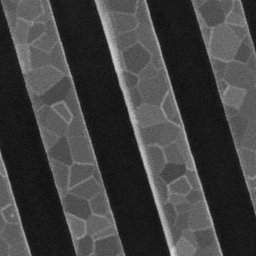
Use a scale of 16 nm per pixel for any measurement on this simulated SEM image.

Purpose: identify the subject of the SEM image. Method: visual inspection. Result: lines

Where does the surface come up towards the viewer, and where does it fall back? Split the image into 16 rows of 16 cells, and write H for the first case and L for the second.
HHHLLLHHHLLLHHHL
LHHLLLHHHHLLHHHL
LHHHLLLHHHLLLHHH
LHHHLLLHHHLLLHHH
LHHHLLLHHHLLLHHH
LLHHHLLLHHHLLLHH
LLHHHLLLHHHLLLHH
LLHHHLLLHHHLLLHH
LLLHHHLLLHHHLLLH
LLLHHHLLLHHHLLLH
LLLHHHLLLHHHLLLH
HLLHHHLLLHHHHLLH
HLLLHHHLLLHHHLLL
HLLLHHHLLLHHHLLL
HLLLHHHLLLHHHLLL
HHLLLHHHLLLHHHLL